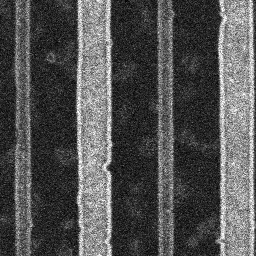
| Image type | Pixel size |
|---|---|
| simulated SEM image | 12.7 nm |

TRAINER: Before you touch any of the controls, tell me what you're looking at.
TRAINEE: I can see one or a few lines or trenches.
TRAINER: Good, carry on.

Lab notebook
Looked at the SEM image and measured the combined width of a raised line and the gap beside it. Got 0.906 µm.